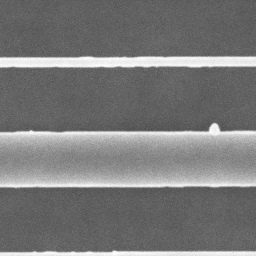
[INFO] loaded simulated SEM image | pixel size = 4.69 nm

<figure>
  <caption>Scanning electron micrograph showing lines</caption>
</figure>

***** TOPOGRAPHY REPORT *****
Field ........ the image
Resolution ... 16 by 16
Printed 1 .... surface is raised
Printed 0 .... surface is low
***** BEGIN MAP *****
0000000000000000
0000000000000000
0000000000000000
0000000000000000
0000000000000000
0000000000000000
0000000000000000
0000000000000000
1111111111111111
1111111111111111
1111111111111111
1111111111111111
0000000000000000
0000000000000000
0000000000000000
0000000000000000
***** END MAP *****